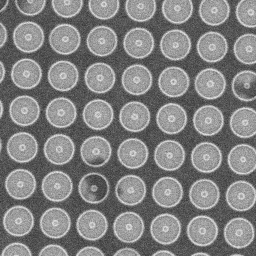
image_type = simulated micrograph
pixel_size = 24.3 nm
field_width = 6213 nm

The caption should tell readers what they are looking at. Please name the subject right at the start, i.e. an array of small figures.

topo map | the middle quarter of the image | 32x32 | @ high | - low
--@@@@@----@@@@@@@-@@@@@@@@@@@@@
---@@@------@@@@-----@@@@@---@@@
---@@@------@@@------@@@@-----@@
---@@-------@@@-------@@-------@
---@@@------@@@-------@@-------@
--@@@@------@@@------@@@-------@
@@@@@@@----@@@@@-----@@@@-----@@
@@@@@@@@@@@@@@@@@@@@@@@@@@---@@@
@@@@@@@@@@@@@@@@@@@@@@@@@@@@@@@@
-@@@@@@---@@@@@@@@@@@@@@@@@@@@@@
--@@@@-----@@@@@----@@@@@---@@@@
---@@-------@@@------@@@------@@
---@@-------@@-------@@@------@@
--@@@-------@@-------@@-------@@
--@@@@------@@-------@@@------@@
@@@@@@@----@@@@-----@@@@------@@
@@@@@@@@@@@@@@@@@--@@@@@@----@@@
@@@@@@@@@@@@@@@@@@@@@@@@@@@@@@@@
-@@@@@@--@@@@@@@@@@@@@@@@@@@@@@@
--@@@------@@@@----@@@@@@--@@@@@
--@@@------@@@------@@@@-----@@@
--@@--------@@-------@@-------@@
--@@-------@@@-------@@-------@@
-@@@@------@@@------@@@-------@@
@@@@@@----@@@@@-----@@@------@@@
@@@@@@@@@@@@@@@@---@@@@@-----@@@
@@@@@@@@@@@@@@@@@@@@@@@@@@@@@@@@
@@@@@@@-@@@@@@@@@@@@@@@@@@@@@@@@
-@@@@-----@@@@@---@@@@@@@@@@@@@@
--@@-------@@@-----@@@@@----@@@@
--@@-------@@-------@@@------@@@
--@@-------@@-------@@-------@@@